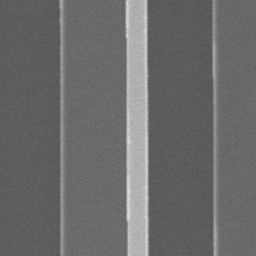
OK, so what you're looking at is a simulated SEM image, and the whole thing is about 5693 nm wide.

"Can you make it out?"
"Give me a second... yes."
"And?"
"lines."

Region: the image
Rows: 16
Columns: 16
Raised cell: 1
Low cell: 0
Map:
0000111110000111
0000111110000111
0000111110000111
0000111110000111
0000111110000111
0000111110000111
0000111110000111
0000111110000111
0000111110000111
0000111110000111
0000111110000111
0000111110000111
0000111110000111
0000111110000111
0000111110000111
0000111110000111